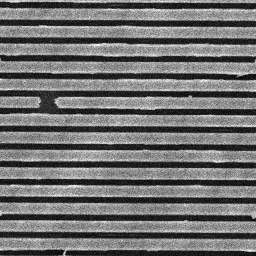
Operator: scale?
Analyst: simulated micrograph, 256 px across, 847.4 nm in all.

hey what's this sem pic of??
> parallel lines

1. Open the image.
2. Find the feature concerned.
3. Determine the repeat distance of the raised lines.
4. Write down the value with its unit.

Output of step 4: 0.0586 um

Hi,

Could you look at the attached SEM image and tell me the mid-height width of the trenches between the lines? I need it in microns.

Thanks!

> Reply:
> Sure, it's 0.0182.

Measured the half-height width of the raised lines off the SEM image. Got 0.0393 microns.